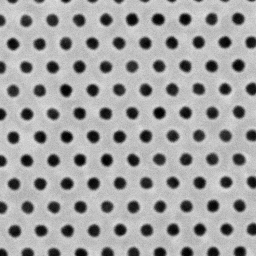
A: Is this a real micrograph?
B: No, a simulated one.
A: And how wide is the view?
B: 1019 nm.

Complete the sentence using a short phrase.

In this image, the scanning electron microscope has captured a regular array of holes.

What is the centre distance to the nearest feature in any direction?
104 nanometres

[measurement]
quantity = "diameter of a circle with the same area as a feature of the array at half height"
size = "54.4 nanometers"